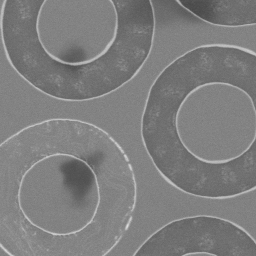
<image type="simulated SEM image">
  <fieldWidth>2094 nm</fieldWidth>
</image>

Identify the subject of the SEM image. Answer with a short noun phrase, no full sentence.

ring-shaped grooves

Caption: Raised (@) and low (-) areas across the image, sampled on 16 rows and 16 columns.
---@@@@--@@@----
--@@@@@---@@@@--
--@@@@@--@@@@@@@
@--@@@---@@-----
@--------@------
@@-----@@@--@@@-
@@@@@@@@@--@@@@@
@@@@@@@@@--@@@@@
@@@@@@@@@--@@@@@
@@@@@@@@@---@@@-
@@@@@@@@@@------
@@@@@@@@@@@-----
@@@@@@@@@@@@@@@@
@@@@@@@@@@@@@@@@
@@@@@@@@@@-----@
@@@@@@@@@-------